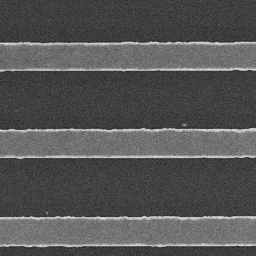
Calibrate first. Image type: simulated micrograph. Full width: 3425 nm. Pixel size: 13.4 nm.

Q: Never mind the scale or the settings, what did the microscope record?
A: lines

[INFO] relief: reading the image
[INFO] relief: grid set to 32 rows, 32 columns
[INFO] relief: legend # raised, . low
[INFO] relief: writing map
................................
................................
................................
................................
................................
################################
################################
################################
################################
................................
................................
................................
................................
................................
................................
................................
################################
################################
################################
################################
................................
................................
................................
................................
................................
................................
................................
################################
################################
################################
################################
................................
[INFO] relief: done